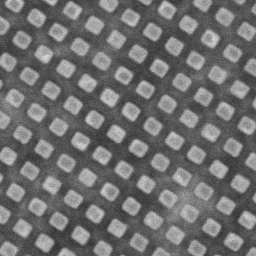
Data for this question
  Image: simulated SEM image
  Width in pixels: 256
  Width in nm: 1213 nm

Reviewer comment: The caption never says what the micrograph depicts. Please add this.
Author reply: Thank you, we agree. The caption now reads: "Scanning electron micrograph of a regular array of raised bodies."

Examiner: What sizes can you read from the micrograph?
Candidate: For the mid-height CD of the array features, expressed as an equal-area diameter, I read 79.8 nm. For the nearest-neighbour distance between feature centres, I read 123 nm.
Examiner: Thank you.